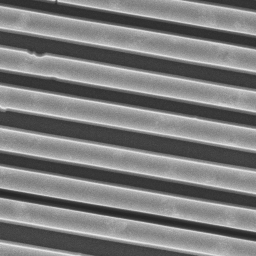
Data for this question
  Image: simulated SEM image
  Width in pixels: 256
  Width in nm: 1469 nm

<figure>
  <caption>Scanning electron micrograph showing parallel lines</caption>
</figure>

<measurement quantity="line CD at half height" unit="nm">133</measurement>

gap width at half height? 86.9 nm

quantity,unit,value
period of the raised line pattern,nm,218